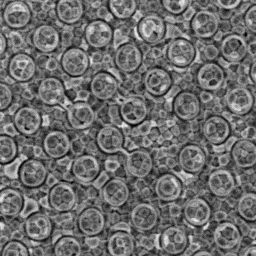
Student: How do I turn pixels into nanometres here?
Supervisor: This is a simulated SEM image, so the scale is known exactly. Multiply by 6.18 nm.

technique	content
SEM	a regular array of raised bodies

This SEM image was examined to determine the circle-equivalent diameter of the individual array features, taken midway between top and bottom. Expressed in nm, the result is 149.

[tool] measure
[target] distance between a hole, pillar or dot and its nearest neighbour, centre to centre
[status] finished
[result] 37 px